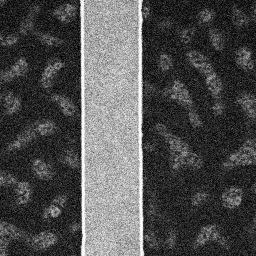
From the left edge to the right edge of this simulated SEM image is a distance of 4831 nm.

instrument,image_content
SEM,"one or a few lines or trenches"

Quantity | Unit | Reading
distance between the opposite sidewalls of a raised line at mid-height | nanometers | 1090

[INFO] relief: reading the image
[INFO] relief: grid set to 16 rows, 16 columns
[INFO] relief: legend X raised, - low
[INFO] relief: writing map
-----XXXX-------
-----XXXX-------
-----XXXX-------
-----XXXX-------
-----XXXX-------
-----XXXX-------
-----XXXX-------
-----XXXX-------
-----XXXX-------
-----XXXX-------
-----XXXX-------
-----XXXX-------
-----XXXX-------
-----XXXX-------
-----XXXX-------
-----XXXX-------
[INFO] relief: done